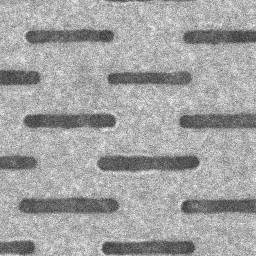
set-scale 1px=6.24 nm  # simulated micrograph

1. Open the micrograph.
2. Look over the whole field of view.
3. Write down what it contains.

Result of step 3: holes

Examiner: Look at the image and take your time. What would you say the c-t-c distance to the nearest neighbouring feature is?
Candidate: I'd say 530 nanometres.